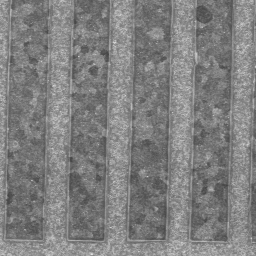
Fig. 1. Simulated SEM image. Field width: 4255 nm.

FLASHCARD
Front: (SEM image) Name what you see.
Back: one or a few lines or trenches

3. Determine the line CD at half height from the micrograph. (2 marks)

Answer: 632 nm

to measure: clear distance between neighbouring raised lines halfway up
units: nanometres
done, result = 395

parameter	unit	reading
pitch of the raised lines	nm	1020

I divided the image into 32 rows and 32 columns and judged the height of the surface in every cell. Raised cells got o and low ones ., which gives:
.ooooo...ooooo...ooooo...oooo...
.ooooo...ooooo...ooooo...oooo...
.ooooo...ooooo...ooooo..ooooo...
.ooooo...ooooo...oooo...ooooo...
.ooooo...ooooo...oooo...ooooo...
.ooooo...ooooo...oooo....oooo...
.ooooo...ooooo...oooo...ooooo...
.ooooo...ooooo...oooo...ooooo...
.ooooo...ooooo...oooo...ooooo...
.ooooo...oooo....oooo...ooooo...
.ooooo...oooo....oooo...ooooo...
.ooooo...oooo....oooo...ooooo...
.ooooo...oooo...ooooo...ooooo...
.ooooo...oooo...ooooo...ooooo...
.ooooo...oooo...ooooo...ooooo...
.ooooo...oooo...ooooo...ooooo...
.ooooo...oooo...ooooo...ooooo...
.ooooo...oooo...ooooo...ooooo...
.ooooo...oooo...ooooo...ooooo..o
.ooooo...oooo...ooooo...ooooo..o
.ooooo...oooo...ooooo...ooooo...
.ooooo...oooo...ooooo...ooooo..o
.ooooo...oooo...ooooo...ooooo..o
.ooooo...oooo...ooooo...ooooo..o
.oooo....oooo...ooooo...ooooo..o
.oooo....oooo...ooooo...ooooo..o
.oooo....oooo...ooooo...ooooo..o
.oooo...ooooo...ooooo...ooooo..o
.oooo...ooooo...ooooo...oooo...o
.oooo...ooooo...ooooo...oooo...o
................................
................................